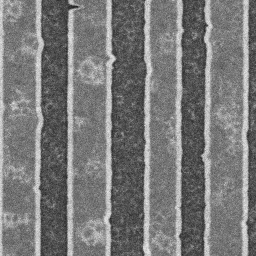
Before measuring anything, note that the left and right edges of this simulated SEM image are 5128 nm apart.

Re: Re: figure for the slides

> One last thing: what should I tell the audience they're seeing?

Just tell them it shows one or a few lines or trenches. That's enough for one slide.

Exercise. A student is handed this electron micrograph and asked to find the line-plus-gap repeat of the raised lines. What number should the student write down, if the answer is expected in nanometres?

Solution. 1370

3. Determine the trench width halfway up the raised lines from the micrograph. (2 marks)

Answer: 0.643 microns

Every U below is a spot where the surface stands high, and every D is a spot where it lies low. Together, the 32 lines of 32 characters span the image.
UUUUUDDDDUUUUUDDDDUUUUDDDDUUUUUD
UUUUUDDDDUUUUUDDDDUUUUDDDDUUUUUD
UUUUUDDDDUUUUUDDDDUUUUDDDDUUUUUD
UUUUUDDDDUUUUUDDDDUUUUDDDDUUUUUD
UUUUUDDDDUUUUUDDDDUUUUDDDDUUUUUD
UUUUUDDDDUUUUUDDDDUUUUDDDDUUUUUD
UUUUUDDDDUUUUUDDDDUUUUDDDDUUUUUD
UUUUUDDDDUUUUUDDDDDUUUDDDDUUUUUD
UUUUUDDDDUUUUUDDDDDUUUDDDDUUUUUD
UUUUUDDDDUUUUUDDDDDUUUDDDDUUUUUD
UUUUUDDDDUUUUUDDDDDUUUDDDDUUUUUD
UUUUUDDDDUUUUDDDDDUUUUDDDDUUUUUD
UUUUUDDDDUUUUUDDDDDUUUDDDDUUUUUD
UUUUUDDDDUUUUUDDDDUUUUDDDDUUUUUD
UUUUUDDDDUUUUDDDDDDUUUDDDDUUUUUD
UUUUUDDDDUUUUUDDDDUUUUDDDDUUUUUD
UUUUUDDDDUUUUUDDDDUUUUDDDDUUUUUD
UUUUUDDDDUUUUUDDDDUUUUDDDDUUUUUD
UUUUUDDDDUUUUUDDDDUUUUDDDDUUUUUD
UUUUUDDDDUUUUUDDDDUUUUDDDDUUUUUD
UUUUUDDDDUUUUUDDDDUUUUDDDDUUUUUD
UUUUUDDDDUUUUUDDDDUUUUDDDDUUUUUD
UUUUUDDDDUUUUUDDDDUUUUDDDDUUUUUD
UUUUUDDDDUUUUUDDDDUUUUDDDDUUUUUD
UUUUUDDDDUUUUUDDDDUUUUDDDDUUUUUD
UUUUUDDDDUUUUUDDDDUUUUDDDDUUUUUD
UUUUUDDDDUUUUUDDDDUUUUDDDDUUUUUD
UUUUUDDDDUUUUDDDDDUUUUDDDDUUUUUD
UUUUUDDDDUUUUUDDDDUUUUDDDDUUUUUD
UUUUUDDDDUUUUUDDDDUUUUDDDDUUUUUD
UUUUUDDDDUUUUUDDDDUUUUDDDDUUUUUD
UUUUUDDDDUUUUUDDDDUUUUDDDDUUUUUD